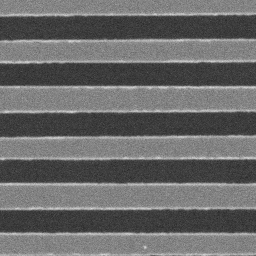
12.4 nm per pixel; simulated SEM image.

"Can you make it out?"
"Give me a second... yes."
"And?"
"lines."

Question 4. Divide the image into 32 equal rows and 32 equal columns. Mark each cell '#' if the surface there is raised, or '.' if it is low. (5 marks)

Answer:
################################
################################
................................
................................
................................
################################
################################
################################
................................
................................
................................
################################
################################
################################
................................
................................
................................
################################
################################
################################
................................
................................
................................
################################
################################
################################
................................
................................
................................
################################
################################
################################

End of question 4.